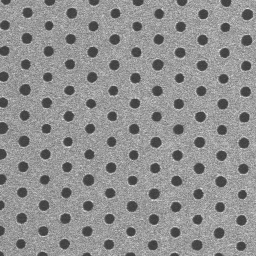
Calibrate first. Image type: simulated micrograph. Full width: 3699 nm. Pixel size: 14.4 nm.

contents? a regular array of holes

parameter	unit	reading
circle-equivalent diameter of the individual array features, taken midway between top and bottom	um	0.153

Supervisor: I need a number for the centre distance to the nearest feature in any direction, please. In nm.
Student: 364